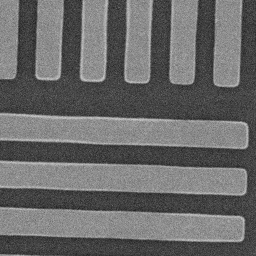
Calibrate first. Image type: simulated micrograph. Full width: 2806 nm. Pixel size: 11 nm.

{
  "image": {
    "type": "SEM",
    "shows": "groups of lines, slits or small figures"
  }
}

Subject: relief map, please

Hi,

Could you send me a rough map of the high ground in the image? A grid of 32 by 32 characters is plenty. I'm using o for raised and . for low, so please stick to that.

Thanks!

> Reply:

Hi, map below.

oo...ooo..ooo...ooo...ooo..ooo..
oo...ooo..ooo...ooo...ooo..ooo..
oo...ooo..ooo...ooo...ooo..ooo..
oo...ooo..ooo...ooo...oo...ooo..
oo...ooo..ooo...ooo...oo...ooo..
oo...ooo..ooo...ooo..ooo...ooo..
oo...oo...ooo...ooo..ooo...ooo..
oo...oo...ooo...ooo..ooo...ooo..
oo...oo...ooo...ooo..ooo...ooo..
oo...oo...ooo...ooo..ooo...ooo..
...........................ooo..
................................
................................
................................
ooooo...........................
oooooooooooooooooooooooooooooo..
ooooooooooooooooooooooooooooooo.
....ooooooooooooooooooooooooooo.
................................
................................
oooooooo........................
ooooooooooooooooooooooooooooooo.
ooooooooooooooooooooooooooooooo.
......ooooooooooooooooooooooooo.
................................
................................
ooooooooooooooooo...............
oooooooooooooooooooooooooooooo..
oooooooooooooooooooooooooooooo..
......oooooooooooooooooooooooo..
................................
................................